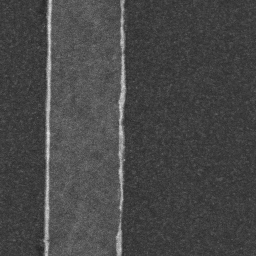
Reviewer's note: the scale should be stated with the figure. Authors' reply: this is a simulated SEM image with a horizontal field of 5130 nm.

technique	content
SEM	one or a few lines or trenches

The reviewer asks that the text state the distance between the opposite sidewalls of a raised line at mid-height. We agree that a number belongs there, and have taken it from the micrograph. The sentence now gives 1460 nm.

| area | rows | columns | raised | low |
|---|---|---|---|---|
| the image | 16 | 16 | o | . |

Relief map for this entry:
...ooooo........
...ooooo........
...ooooo........
...ooooo........
...ooooo........
...ooooo........
...ooooo........
...ooooo........
...ooooo........
...oooo.........
...ooooo........
...ooooo........
...ooooo........
...ooooo........
...oooo.........
...oooo.........